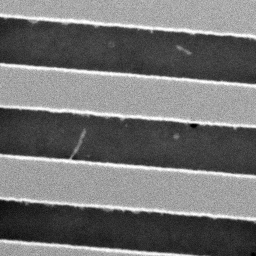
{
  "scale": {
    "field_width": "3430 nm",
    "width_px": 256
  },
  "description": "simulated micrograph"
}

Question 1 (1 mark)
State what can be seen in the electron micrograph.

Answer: lines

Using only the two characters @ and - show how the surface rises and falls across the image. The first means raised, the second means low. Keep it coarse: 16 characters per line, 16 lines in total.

@@@@@@@@@@@@@@@@
-----@@@@@@@@@@@
----------------
----------------
@@@@@@----------
@@@@@@@@@@@@@@@@
@@@@@@@@@@@@@@@@
----------@@@@@@
----------------
----------------
@@@@@@@@@@------
@@@@@@@@@@@@@@@@
-@@@@@@@@@@@@@@@
-------------@@@
----------------
@@@@@@----------